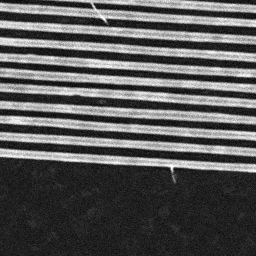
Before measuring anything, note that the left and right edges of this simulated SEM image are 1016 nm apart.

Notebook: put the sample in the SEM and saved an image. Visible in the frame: parallel lines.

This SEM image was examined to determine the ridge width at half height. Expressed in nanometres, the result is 26.8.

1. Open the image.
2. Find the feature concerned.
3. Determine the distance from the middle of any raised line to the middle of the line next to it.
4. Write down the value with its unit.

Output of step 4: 63.8 nanometres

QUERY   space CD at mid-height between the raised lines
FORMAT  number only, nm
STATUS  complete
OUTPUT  38.1